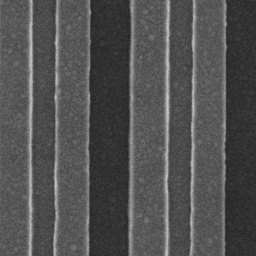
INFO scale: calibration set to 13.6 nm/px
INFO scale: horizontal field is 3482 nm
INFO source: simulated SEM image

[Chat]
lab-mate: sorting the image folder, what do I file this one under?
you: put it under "lines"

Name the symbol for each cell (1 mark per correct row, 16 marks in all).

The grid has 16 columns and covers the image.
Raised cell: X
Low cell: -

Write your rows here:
XXXXXX--XXXXXX--
XXXXXX--XXXXXX--
XXXXXX--XXXXXX--
XXXXXX--XXXXXX--
XXXXXX--XXXXXX--
XXXXXX--XXXXXX--
XXXXXX--XXXXXX--
XXXXXX--XXXXXX--
XXXXXX--XXXXXX--
XXXXXX--XXXXXX--
XXXXXX--XXXXXX--
XXXXXX--XXXXXX--
XXXXXX--XXXXXX--
XXXXXX--XXXXXX--
XXXXXX--XXXXXX--
XXXXXX--XXXXXX--